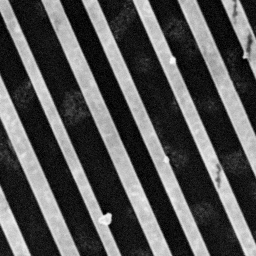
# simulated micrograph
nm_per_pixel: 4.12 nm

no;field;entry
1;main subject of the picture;parallel lines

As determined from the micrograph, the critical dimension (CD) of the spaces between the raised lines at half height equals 117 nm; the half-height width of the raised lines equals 12.8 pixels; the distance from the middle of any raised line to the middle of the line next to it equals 173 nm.